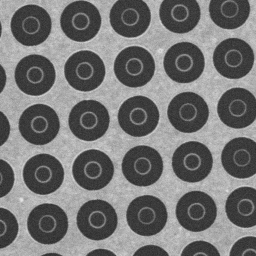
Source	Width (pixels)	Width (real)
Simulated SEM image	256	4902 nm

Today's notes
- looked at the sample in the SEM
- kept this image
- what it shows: an array of small figures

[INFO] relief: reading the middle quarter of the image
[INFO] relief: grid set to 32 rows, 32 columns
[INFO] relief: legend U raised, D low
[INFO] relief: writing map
DDDDUUUDDDUUDDDDUUUDDDDUUDDDUUUU
DDDUUUUDDDDUDDDDUUUDDDDUUDDDDUUD
DDDUUUUDDDDUUDDDDUDDDDDUUUDDDDDD
DDDDUUDDDDUUUDDDDDDDDDUUUUDDDDDD
UDDDDDDDDDUUUUDDDDDDDUUUUUUUDDDD
UUDDDDDDDUUUUUUDDDDDUUUUUUUUUUUU
UUUDDDDDUUUUUUUUUUUUUUUUUUUUUUUU
UUUUUUUUUUUUUUUUUUUUUUUUUUUUDDDD
UUUUUUUUUUUUUUUUDDDDDUUUUUUDDDDD
UUUUDDDDDUUUUUUDDDDDDDDUUUDDDDDD
UUDDDDDDDDUUUUDDDDDDDDDUUUDDDDUU
UUDDDDDDDDDUUUDDDDUUDDDDUUDDDUUU
UDDDDUUDDDDUUDDDDUUUDDDDUUDDDUUU
UDDDUUUUDDDDUDDDDUUUDDDDUUDDDDUU
UDDDUUUUDDDDUDDDDUUUDDDDUUDDDDDD
UDDDDUUUDDDUUUDDDDDDDDDUUUUDDDDD
UUDDDDDDDDDUUUUDDDDDDDDUUUUUDDDD
UUDDDDDDDDUUUUUUDDDDDDUUUUUUUUUU
UUUDDDDDDUUUUUUUUUUUUUUUUUUUUUUU
UUUUUUDUUUUUUUUUUUUUUUUUUUUUUUDD
UUUUUUUUUUUUUUUUUUDDDUUUUUUUUDDD
UUUUUDDDDUUUUUUUDDDDDDDUUUUUDDDD
UUUUDDDDDDDUUUUDDDDDDDDDUUUDDDDD
UUUDDDDDDDDDUUUDDDDDDDDDUUUDDDUU
UUDDDDDDDDDDUUDDDDUUUDDDDUUDDDUU
UUDDDDUUUDDDDUDDDDUUUUDDDUUDDDUU
UUDDDUUUUDDDDUDDDDUUUDDDDUUDDDDD
UUDDDDUUUDDDDUUDDDDDDDDDDUUUDDDD
UUDDDDDDDDDDUUUDDDDDDDDDUUUUUDDD
UUUDDDDDDDDDUUUUDDDDDDDUUUUUUUUD
UUUUDDDDDDDUUUUUUUDDDUUUUUUUUUUU
UUUUUDDDDUUUUUUUUUUUUUUUUUUUUUUU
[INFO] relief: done